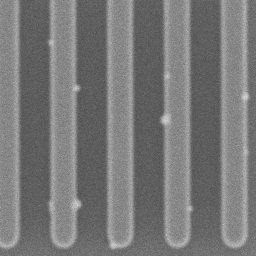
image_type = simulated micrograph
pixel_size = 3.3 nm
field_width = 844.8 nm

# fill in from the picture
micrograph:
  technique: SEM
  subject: groups of lines, slits or small figures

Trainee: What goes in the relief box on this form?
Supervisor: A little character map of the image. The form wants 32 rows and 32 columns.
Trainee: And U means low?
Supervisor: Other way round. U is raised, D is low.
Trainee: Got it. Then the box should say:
UUDDDDUUUDDDDUUUUDDDDUUUDDDDUUUD
UUDDDDUUUDDDDUUUUDDDDUUUDDDDUUUD
UUDDDDUUUDDDDUUUUDDDDUUUDDDDUUUD
UUDDDDUUUDDDDUUUUDDDDUUUDDDDUUUD
UUDDDDUUUDDDDUUUUDDDDUUUDDDDUUUD
UUDDDDUUUDDDDUUUUDDDDUUUDDDDUUUD
UUDDDDUUUDDDDUUUUDDDDUUUDDDDUUUD
UUDDDDUUUDDDDUUUUDDDDUUUDDDDUUUD
UUDDDDUUUDDDDUUUUDDDDUUUDDDDUUUD
UUDDDDUUUDDDDUUUUDDDDUUUDDDDUUUD
UUDDDDUUUUDDDUUUUDDDDUUUDDDDUUUD
UUDDDDUUUUDDDUUUUDDDDUUUDDDDUUUD
UUDDDDUUUDDDDUUUUDDDDUUUDDDDUUUD
UUDDDDUUUDDDDDUUUDDDDUUUDDDDUUUD
UUDDDDUUUDDDDDUUUDDDUUUUDDDDUUUD
UUDDDDUUUDDDDDUUUDDDUUUUDDDDUUUD
UUDDDDUUUDDDDDUUUDDDDUUUDDDDUUUD
UUDDDDUUUDDDDDUUUDDDDUUUDDDDUUUD
UUDDDDUUUDDDDDUUUDDDDUUUDDDDUUUD
UUDDDDUUUDDDDDUUUDDDDUUUDDDDUUUD
UUDDDDUUUDDDDDUUUDDDDUUUDDDDUUUD
UUDDDDUUUDDDDDUUUDDDDUUUDDDDUUUD
UUDDDDUUUDDDDDUUUDDDDUUUDDDDUUUD
UUDDDDUUUDDDDDUUUDDDDUUUDDDDUUUD
UUDDDDUUUUDDDDUUUDDDDUUUDDDDUUUD
UUDDDDUUUUDDDDUUUDDDDUUUDDDDUUUD
UUDDDDUUUUDDDDUUUDDDDUUUDDDDUUUD
UUDDDDUUUDDDDDUUUDDDDUUUDDDDUUUD
UUDDDDUUUDDDDDUUUDDDDUUUDDDDUUUD
UUDDDDUUUDDDDDUUUDDDDUUUDDDDUUUD
UUDDDDDUUDDDDDUUDDDDDUUDDDDDUUDD
DDDDDDDDDDDDDDDDDDDDDDDDDDDDDDDD